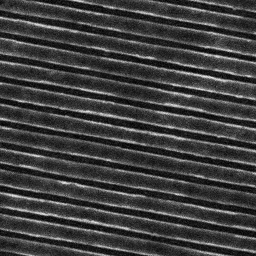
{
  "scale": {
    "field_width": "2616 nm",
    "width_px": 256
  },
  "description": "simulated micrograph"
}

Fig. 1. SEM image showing parallel lines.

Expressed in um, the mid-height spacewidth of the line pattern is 0.0704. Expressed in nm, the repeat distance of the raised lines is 220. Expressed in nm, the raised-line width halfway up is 150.